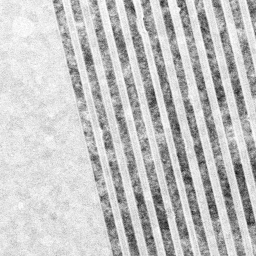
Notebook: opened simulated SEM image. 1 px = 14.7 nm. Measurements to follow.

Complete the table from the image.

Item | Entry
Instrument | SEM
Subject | parallel lines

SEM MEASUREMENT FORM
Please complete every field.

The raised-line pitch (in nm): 252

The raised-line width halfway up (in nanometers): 98.2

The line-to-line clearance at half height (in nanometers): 148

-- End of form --